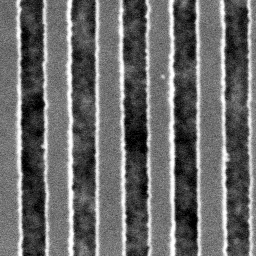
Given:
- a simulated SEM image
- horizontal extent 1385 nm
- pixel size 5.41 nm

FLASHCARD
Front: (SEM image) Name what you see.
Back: lines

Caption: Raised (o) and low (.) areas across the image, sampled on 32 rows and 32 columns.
oo....ooo...ooo...ooo....ooo...o
ooo..oooo...ooo...ooo....ooo...o
oo...oooo...ooo...oooo...ooo...o
ooo...ooo...ooo...oooo...ooo...o
ooo...ooo...ooo...oooo...ooo...o
ooo...ooo...ooo...oooo...ooo...o
ooo...ooo...ooo...oooo...ooo...o
ooo...ooo...ooo...oooo...ooo...o
ooo..oooo...ooo...oooo...ooo...o
ooo...ooo...ooo...oooo...ooo...o
ooo...ooo...ooo...oooo...ooo...o
ooo...ooo...ooo...oooo...ooo...o
ooo...ooo...ooo...oooo...ooo...o
ooo...ooo...ooo...oooo...ooo...o
ooo...ooo...ooo...oooo...ooo...o
ooo...ooo...ooo...oooo...ooo...o
ooo...ooo...ooo....ooo...ooo...o
ooo...ooo...ooo....ooo...ooo...o
ooo...ooo...ooo....ooo...ooo...o
ooo...ooo...oooo...ooo...ooo...o
ooo...ooo...oooo..oooo...ooo...o
ooo...ooo...oooo...ooo...ooo...o
ooo...ooo...oooo...ooo...ooo...o
ooo...ooo...oooo...ooo...ooo...o
ooo...ooo...oooo...ooo...ooo...o
ooo...ooo...oooo...ooo...ooo...o
ooo...ooo...oooo...ooo...ooo...o
ooo...ooo...oooo...ooo...ooo...o
ooo...ooo...oooo...ooo...ooo...o
ooo...ooo...oooo...ooo...ooo...o
ooo...ooo...oooo...ooo...ooo...o
ooo...ooo...oooo...ooo...ooo...o